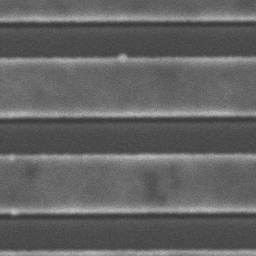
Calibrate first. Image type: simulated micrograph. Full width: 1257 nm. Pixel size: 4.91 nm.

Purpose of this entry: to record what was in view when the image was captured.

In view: lines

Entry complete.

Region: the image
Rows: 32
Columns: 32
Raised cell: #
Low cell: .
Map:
################################
################################
################################
................................
................................
................................
................................
################################
################################
################################
################################
################################
################################
################################
################################
................................
................................
................................
................................
################################
################################
################################
################################
################################
################################
################################
##################..............
................................
................................
................................
................................
################################